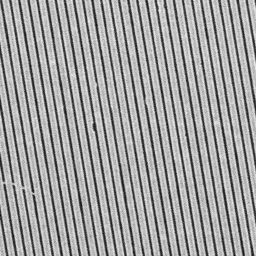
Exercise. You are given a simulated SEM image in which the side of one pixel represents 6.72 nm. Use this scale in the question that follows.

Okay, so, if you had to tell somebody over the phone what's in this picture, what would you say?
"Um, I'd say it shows parallel lines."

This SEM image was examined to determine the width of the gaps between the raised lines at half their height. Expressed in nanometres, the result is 20.7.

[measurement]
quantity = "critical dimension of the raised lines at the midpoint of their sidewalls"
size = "0.0373 micrometres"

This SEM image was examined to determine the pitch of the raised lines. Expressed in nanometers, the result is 60.3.